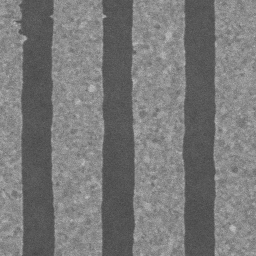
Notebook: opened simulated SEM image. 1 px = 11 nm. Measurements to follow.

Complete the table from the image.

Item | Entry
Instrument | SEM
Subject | one or a few lines or trenches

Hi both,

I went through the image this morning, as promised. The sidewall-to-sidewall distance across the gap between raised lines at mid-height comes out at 348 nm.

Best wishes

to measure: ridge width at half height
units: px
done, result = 49.5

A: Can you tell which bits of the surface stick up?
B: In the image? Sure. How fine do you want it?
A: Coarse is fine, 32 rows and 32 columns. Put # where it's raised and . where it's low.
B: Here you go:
##.....######....######....#####
###....######....######....#####
##.....######....######....#####
##.....######....######....#####
###....######....######....#####
###....######....######....#####
###....######....######....#####
###....######....######....#####
###....######....######....#####
###....######....######....#####
###....######....######....#####
###....######....######....#####
###....######....######....#####
###....######....######....#####
###....######....######....#####
###....######....######....#####
###....######....######....#####
###....######....######....#####
###....######....######....#####
###....######....######....#####
###....######....######....#####
###....######....######....#####
###....######....######....#####
###....######....######....#####
###....######....######....#####
###....######....######....#####
###....######....######....#####
###....######....######....#####
###....######....######....#####
###....######....######....#####
###....######....######....#####
###....######....######....#####